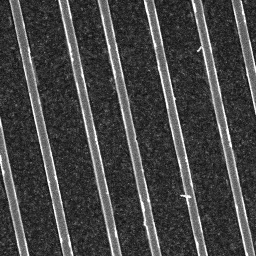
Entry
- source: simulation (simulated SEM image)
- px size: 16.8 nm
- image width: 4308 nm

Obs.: parallel lines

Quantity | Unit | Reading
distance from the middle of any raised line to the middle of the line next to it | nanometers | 745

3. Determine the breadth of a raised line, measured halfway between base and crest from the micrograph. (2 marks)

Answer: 146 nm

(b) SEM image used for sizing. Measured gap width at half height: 0.617 microns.